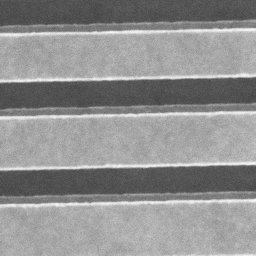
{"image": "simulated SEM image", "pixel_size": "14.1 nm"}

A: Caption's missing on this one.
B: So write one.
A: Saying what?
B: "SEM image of lines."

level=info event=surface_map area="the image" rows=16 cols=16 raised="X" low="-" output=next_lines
----------------
----------------
XXXXXXXXXXXXXXXX
XXXXXXXXXXXXXXXX
XXXXXXXXXXXXXXXX
----------------
----------------
XXXXXXXXXXXXXXXX
XXXXXXXXXXXXXXXX
XXXXXXXXXXXXXXXX
XXXXX-----------
----------------
-------------XXX
XXXXXXXXXXXXXXXX
XXXXXXXXXXXXXXXX
XXXXXXXXXXXXXXXX